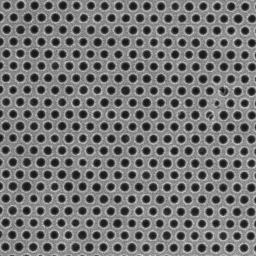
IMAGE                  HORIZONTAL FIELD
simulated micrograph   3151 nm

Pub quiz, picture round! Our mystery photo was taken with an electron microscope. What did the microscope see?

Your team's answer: a regular array of raised bodies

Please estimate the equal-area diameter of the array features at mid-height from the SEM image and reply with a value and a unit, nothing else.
0.125 microns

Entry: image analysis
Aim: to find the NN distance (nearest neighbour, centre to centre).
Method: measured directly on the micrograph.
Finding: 167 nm